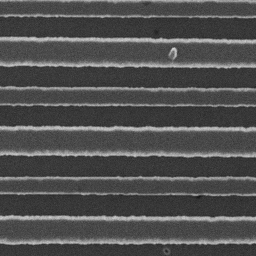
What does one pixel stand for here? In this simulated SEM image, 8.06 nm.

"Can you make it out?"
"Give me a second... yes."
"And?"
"lines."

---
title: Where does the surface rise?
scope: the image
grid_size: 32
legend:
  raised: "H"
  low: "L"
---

HHHHHHHHHHHHHHHHHHHHHHHHHHHHHHHH
HHHHHHHHHHHHHHHHHHHHHHHHHHHHHHHH
LLLLLLLLLLLLLLLLLLLLLLLLLLLLLLLL
LLLLLLLLLLLLLLLLLLLLLLLLLLLLLLLL
LLLLLLLLLLLLLLLLLLLLLLLLLLLLLLLL
HHHHHHHHHHHHHHHHHHHHHHHHHHHHHHHH
HHHHHHHHHHHHHHHHHHHHHHHHHHHHHHHH
HHHHHHHHHHHHHHHHHHHHHHHHHHHHHHHH
LLLLLLLLLLLLLLLLLLLLLLLLLLLLLLLL
LLLLLLLLLLLLLLLLLLLLLLLLLLLLLLLL
LLLLLLLLLLLLLLLLLLLLLLLLLLLLLLLL
HHHHHHHHHHHHHHHHHHHHHHHHHHHHHHHH
HHHHHHHHHHHHHHHHHHHHHHHHHHHHHHHH
LLLLLLLLLLLLLLLLLLLLLLLLLLLLLLLL
LLLLLLLLLLLLLLLLLLLLLLLLLLLLLLLL
LLLLLLLLLLLLLLLLLLLLLLLLLLLLLLLL
HHHHHHHHHHHHHHHHHHHHHHHHHHHHHHHH
HHHHHHHHHHHHHHHHHHHHHHHHHHHHHHHH
HHHHHHHHHHHHHHHHHHHHHHHHHHHHHHHH
LLLLLLLLLLLLLLLLLLLLLLLLLLLLLLLH
LLLLLLLLLLLLLLLLLLLLLLLLLLLLLLLL
LLLLLLLLLLLLLLLLLLLLLLLLLLLLLLLL
HHHHHHHHHHHHHHHHHHHHHHHHHHHHHHHH
HHHHHHHHHHHHHHHHHHHHHHHHHHHHHHHH
LLLLLLLLLLLLLLLLLLLLLLLLLLLLLLLL
LLLLLLLLLLLLLLLLLLLLLLLLLLLLLLLL
LLLLLLLLLLLLLLLLLLLLLLLLLLLLLLLL
HHHHHHHHHHHHHHHHHHHHHHHHHHHHHHHH
HHHHHHHHHHHHHHHHHHHHHHHHHHHHHHHH
HHHHHHHHHHHHHHHHHHHHHHHHHHHHHHHH
LLLLLLLLLLLLLLLLLLLLLLLLLLLLLLLL
LLLLLLLLLLLLLLLLLLLLLLLLLLLLLLLL